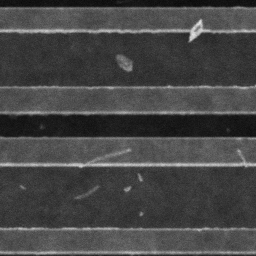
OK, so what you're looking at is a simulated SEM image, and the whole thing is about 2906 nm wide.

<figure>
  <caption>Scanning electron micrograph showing lines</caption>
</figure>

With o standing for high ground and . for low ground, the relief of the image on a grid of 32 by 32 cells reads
................................
oooooooooooooooooooooooooooooooo
oooooooooooooooooooooooooooooooo
oooooooooooooooooooooooooooooooo
........................o.......
................................
................................
................................
................................
................................
................................
oooooooooooooooooooooooooooooooo
oooooooooooooooooooooooooooooooo
oooooooooooooooooooooooooooooooo
................................
................................
................................
oooooooooooooooooooooooooooooooo
oooooooooooooooooooooooooooooooo
oooooooooooooooooooooooooooooooo
oooooooooooooooooooooooooooooooo
................................
................................
................................
................................
................................
................................
................................
................................
oooooooooooooooooooooooooooooooo
oooooooooooooooooooooooooooooooo
oooooooooooooooooooooooooooooooo